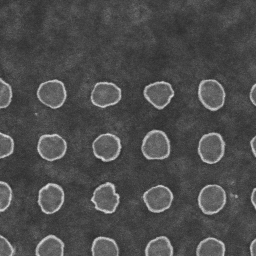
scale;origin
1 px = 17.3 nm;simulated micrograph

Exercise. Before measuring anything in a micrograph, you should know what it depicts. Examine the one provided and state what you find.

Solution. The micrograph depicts a regular array of raised bodies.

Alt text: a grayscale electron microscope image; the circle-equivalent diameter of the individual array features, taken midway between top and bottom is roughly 465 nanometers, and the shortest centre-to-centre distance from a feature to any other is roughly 890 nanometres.